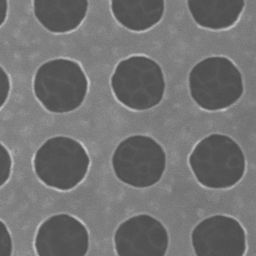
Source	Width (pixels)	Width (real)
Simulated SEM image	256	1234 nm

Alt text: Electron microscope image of holes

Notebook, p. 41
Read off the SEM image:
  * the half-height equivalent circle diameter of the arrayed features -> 257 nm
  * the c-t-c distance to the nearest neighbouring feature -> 77.4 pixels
